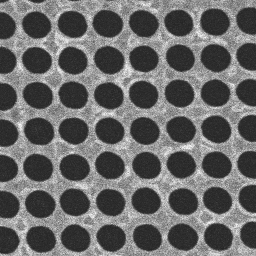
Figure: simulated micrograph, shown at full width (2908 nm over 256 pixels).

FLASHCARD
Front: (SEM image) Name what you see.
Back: a regular array of holes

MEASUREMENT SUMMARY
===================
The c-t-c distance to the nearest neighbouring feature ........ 397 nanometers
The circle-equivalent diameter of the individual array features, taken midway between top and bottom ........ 324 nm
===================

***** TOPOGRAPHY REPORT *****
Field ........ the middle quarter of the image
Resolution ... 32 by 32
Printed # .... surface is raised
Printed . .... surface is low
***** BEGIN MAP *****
......##.......##......###......
.....####.....####....######...#
##..#######.####################
################################
...###############...######....#
.....###......###......###......
......##.......#.......##.......
......##.......#........#.......
......##.......#........#.......
......##.......##......###......
.....####.....####....######...#
################################
################################
#..#######..######...######....#
.....###......###......###......
......##.......##.......##......
......##.......#........##......
......##.......##.......##......
......###......##......####.....
#....#####....####.....#####...#
################################
################################
##.######....######...#####....#
.....###......####......##......
......##.......##.......##......
......##.......##.......##......
......##.......##.......##......
......###......###......###.....
.....#####....#####....#####..##
################################
################################
#...######...#####....######...#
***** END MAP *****